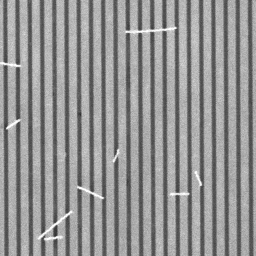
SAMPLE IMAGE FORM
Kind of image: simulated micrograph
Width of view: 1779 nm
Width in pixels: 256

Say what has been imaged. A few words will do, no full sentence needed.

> parallel lines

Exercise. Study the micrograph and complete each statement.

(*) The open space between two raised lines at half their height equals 31.3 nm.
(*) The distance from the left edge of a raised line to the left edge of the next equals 84.9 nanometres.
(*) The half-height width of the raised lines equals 56.4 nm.